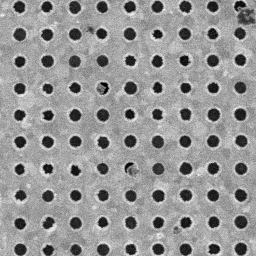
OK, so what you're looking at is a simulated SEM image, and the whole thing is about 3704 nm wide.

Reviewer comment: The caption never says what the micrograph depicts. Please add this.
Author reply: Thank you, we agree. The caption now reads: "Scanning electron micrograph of a regular array of holes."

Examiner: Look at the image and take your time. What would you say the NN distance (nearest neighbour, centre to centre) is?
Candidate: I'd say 384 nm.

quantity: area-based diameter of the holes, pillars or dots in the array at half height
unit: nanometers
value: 173